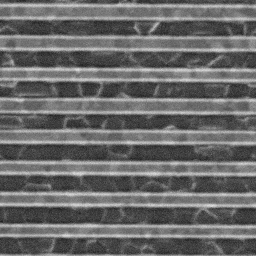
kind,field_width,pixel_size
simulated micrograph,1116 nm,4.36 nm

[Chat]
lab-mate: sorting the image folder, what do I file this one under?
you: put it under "parallel lines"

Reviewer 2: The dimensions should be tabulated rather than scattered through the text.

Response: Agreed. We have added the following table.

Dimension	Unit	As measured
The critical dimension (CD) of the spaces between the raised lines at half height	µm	0.0889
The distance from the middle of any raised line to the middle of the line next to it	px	31.3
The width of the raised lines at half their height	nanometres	45.8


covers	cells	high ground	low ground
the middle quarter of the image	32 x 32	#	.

................................
##############################..
################################
################################
................................
................................
................................
................................
................................
################################
################################
################################
................................
................................
................................
................................
................................
################################
################################
################################
................................
................................
................................
................................
................................
################################
################################
............................#...
................................
................................
................................
................................